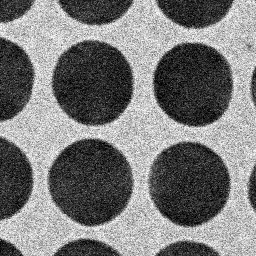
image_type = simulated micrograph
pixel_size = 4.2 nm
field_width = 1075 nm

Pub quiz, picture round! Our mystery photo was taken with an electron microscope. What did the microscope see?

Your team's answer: holes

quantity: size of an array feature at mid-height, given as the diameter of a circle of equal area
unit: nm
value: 353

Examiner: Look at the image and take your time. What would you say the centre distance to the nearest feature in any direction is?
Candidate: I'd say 414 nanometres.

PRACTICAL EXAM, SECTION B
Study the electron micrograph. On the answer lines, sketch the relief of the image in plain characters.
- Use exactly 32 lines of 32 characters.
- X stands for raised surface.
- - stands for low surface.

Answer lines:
----XXX----------XXX---------XXX
---XXXXX--------XXXX---------XXX
--XXXXXXX------XXXXXX-------XXXX
XXXXXXXXXXXXXXXXXXXXXXX---XXXXXX
XXXXXXXXXXXXXXXXXXXXXXXXXXXXXXXX
--XXXXXXX-----XXXXXXXX----XXXXXX
---XXXXX-------XXXXXX------XXXXX
----XXX---------XXXX--------XXXX
----XXX---------XXX----------XXX
----XXX----------XX----------XX-
----XX-----------XX----------XX-
----XXX----------XX----------XX-
----XXX---------XXX----------XX-
---XXXXX--------XXXX---------XXX
--XXXXXX-------XXXXXX-------XXXX
XXXXXXXXXX---XXXXXXXXXX---XXXXXX
XXXXXXXXXXXXXXXXXXXXXXXXXXXXXXXX
-XXXXXXXXX---XXXXXXXXXXXXXXXXXXX
--XXXXXX-------XXXXXX-----XXXXXX
---XXXX---------XXXX--------XXXX
----XX----------XXX---------XXXX
----XX-----------XX----------XX-
----XX-----------XX----------XX-
----XX-----------X-----------XX-
----XX----------XXX----------XX-
---XXXX---------XXX---------XXX-
--XXXXXX-------XXXXX-------XXXXX
-XXXXXXXX-----XXXXXXX-----XXXXXX
XXXXXXXXXXXXXXXXXXXXXXXXXXXXXXXX
XXXXXXXXXXXXXXXXXXXXXXXXXXXXXXXX
--XXXXXX-----XXXXXXXX-----XXXXXX
---XXXX--------XXXXX-------XXXXX